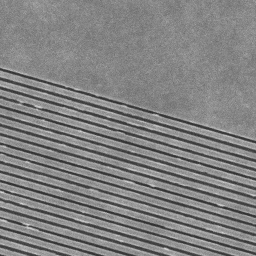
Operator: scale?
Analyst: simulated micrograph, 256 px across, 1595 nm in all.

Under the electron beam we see parallel lines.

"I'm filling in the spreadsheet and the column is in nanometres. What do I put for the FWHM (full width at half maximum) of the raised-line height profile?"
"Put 38.2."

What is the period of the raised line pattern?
55.8 nanometers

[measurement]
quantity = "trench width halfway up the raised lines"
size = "16.5 nanometres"